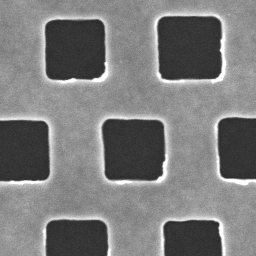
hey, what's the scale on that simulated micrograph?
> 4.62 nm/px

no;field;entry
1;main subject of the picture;holes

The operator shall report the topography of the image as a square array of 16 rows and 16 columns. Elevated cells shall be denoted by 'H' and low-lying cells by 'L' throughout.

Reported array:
HHHHHHHHHHHHHHHH
HHHLLLHHHHLLLLHH
HHHLLLLHHHLLLLHH
HHHLLLLHHHLLLLHH
HHHLLLHHHHLLLLHH
HHHHHHHHHHHHHHHH
HHHHHHHHHHHHHHHH
LLHHHHHLLLHHHHLL
LLLHHHLLLLHHHHLL
LLLHHHHLLLHHHHLL
LLLHHHHLLLHHHHLL
HHHHHHHHHHHHHHHH
HHHHHHHHHHHHHHHH
HHHHHHHHHHHHHHHH
HHHLLLLHHHLLLLHH
HHHLLLLHHHLLLLHH